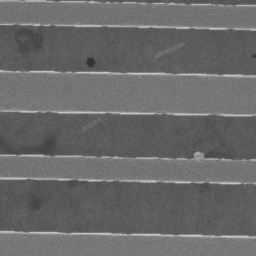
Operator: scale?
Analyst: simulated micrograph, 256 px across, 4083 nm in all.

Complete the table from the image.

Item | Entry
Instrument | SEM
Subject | lines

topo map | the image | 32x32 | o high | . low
ooooooooooooooooooo.............
oooooooooooooooooooooooooooooooo
oooooooooooooooooooooooooooooooo
..........................oooooo
................................
................................
................................
................................
................................
ooooooooooooooooooooooooooooooo.
oooooooooooooooooooooooooooooooo
oooooooooooooooooooooooooooooooo
oooooooooooooooooooooooooooooooo
oooooooooooooooooooooooooooooooo
................................
................................
................................
................................
................................
oooooo..................o.......
oooooooooooooooooooooooooooooooo
oooooooooooooooooooooooooooooooo
..........oooooooooooooooooooooo
................................
................................
................................
................................
................................
................................
ooooooooooooooooooooo...........
oooooooooooooooooooooooooooooooo
oooooooooooooooooooooooooooooooo